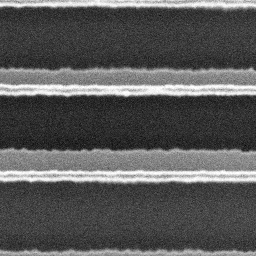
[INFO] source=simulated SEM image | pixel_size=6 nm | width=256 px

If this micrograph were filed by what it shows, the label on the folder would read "lines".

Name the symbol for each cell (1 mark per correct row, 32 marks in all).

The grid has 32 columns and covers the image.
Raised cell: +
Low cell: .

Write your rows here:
++++++++++++++++++++++++++++++++
................................
................................
................................
................................
................................
................................
................................
................................
++++++++++++++++++++++++++++++++
++++++++++++++++++++++++++++++++
++++++++++++++++++++++++++++++++
................................
................................
................................
................................
................................
................................
................................
++++++++++++++++++++++++++++++++
++++++++++++++++++++++++++++++++
++++++++++++++++++++++++++++++++
++.+++++.+++++++++++++++++++++++
................................
................................
................................
................................
................................
................................
................................
................................
+...+........++........+.....+..